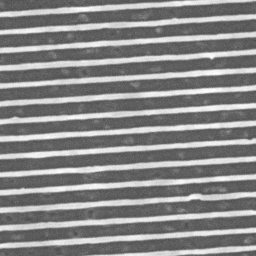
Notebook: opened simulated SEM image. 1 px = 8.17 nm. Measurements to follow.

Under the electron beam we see parallel lines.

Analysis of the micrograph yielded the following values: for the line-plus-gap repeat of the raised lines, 0.145 µm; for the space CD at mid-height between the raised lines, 106 nm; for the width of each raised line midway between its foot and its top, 35.7 nm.